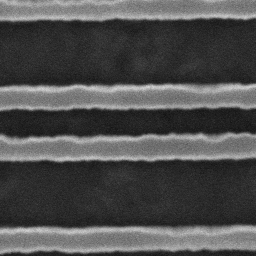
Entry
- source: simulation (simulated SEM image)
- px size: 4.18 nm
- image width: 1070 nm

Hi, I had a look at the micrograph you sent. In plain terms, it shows lines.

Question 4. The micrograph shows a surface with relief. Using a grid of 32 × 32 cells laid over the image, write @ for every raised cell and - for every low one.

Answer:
@@@@@@@@@@@@@@@@@@@@@@@@@@@@@@@@
@@@@@@@@@@@@@@@@@@@@@@@@@@@@@@@@
-@@-----------------------------
--------------------------------
--------------------------------
--------------------------------
--------------------------------
--------------------------------
--------------------------------
--------------------------------
--------------------------------
@@@@@@@@@@@@@@@@@@@@@@@@@@@@@@@@
@@@@@@@@@@@@@@@@@@@@@@@@@@@@@@@@
@@@@@@@@@----@@@--@-------------
--------------------------------
--------------------------------
--------------------------------
@@@@@@@@@@@@@@@@@@@@@@@@@@@@@@@@
@@@@@@@@@@@@@@@@@@@@@@@@@@@@@@@@
@@@@@@@@@@@@@@@@@@@@@@@@@@@@@@@@
--------------------------------
--------------------------------
--------------------------------
--------------------------------
--------------------------------
--------------------------------
--------------------------------
--------------------------------
-----------------------------@@-
@@@@@@@@@@@@@@@@@@@@@@@@@@@@@@@@
@@@@@@@@@@@@@@@@@@@@@@@@@@@@@@@@
@---------@---------------------